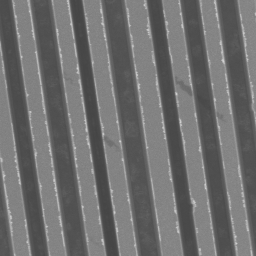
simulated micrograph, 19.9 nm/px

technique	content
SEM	parallel lines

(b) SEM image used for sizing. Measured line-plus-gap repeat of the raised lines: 0.734 microns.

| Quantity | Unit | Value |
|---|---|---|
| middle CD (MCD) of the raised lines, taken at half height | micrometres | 0.406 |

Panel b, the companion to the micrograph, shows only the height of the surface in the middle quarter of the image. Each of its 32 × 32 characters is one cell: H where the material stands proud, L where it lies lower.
HHHHLLLHHHHHLLLLLHHHHHHLLLLHHHHH
HHHHLLLHHHHHLLLLLHHHHHHLLLLHHHHH
HHHHLLLHHHHHLLLLLLHHHHHHLLLHHHHH
HHHHLLLHHHHHLLLLLLHHHHHHLLLHHHHH
HHHHHLLHHHHHLLLLLLHHHHHHLLLHHHHH
HHHHHLLHHHHHLLLLLLHHHHHHLLLHHHHH
HHHHHLLLHHHHHLLLLLHHHHHHLLLLHHHH
HHHHHLLLHHHHHLLLLLHHHHHHLLLLHHHH
HHHHHLLLHHHHHLLLLLHHHHHHLLLLHHHH
HHHHHLLLHHHHHLLLLLLHHHHHHLLLHHHH
HHHHHLLLHHHHHLLLLLLHHHHHHLLLHHHH
LHHHHHLLHHHHHHLLLLLHHHHHHLLLHHHH
LHHHHHLLHHHHHHLLLLLHHHHHHLLLHHHH
LHHHHHLLLHHHHHLLLLLHHHHHHLLLLHHH
LHHHHHLLLHHHHHLLLLLHHHHHHLLLLHHH
LHHHHHLLLHHHHHLLLLLHHHHHHLLLLHHH
LHHHHHLLLHHHHHLLLLLLHHHHHHLLLHHH
LHHHHHLLLHHHHHLLLLLLHHHHHHLLLHHH
LLHHHHHLLHHHHHLLLLLLHHHHHHLLLHHH
LLHHHHHLLHHHHHLLLLLLHHHHHHLLLHHH
LLHHHHHLLLHHHHHLLLLLHHHHHHLLLLHH
LLHHHHHLLLHHHHHLLLLLHHHHHHLLLLHH
LLHHHHHLLLHHHHHLLLLLHHHHHHLLLLHH
LLHHHHHLLLHHHHHLLLLLLHHHHHHLLLHH
LLHHHHHLLLHHHHHLLLLLLHHHHHHLLLHH
LLLHHHHHLLHHHHHLLLLLLHHHHHHLLLHH
LLLHHHHHLLHHHHHLLLLLLHHHHHHLLLHH
LLLHHHHHLLLHHHHHLLLLLHHHHHHLLLLH
LLLHHHHHLLLHHHHHLLLLLHHHHHHLLLLH
LLLHHHHHLLLHHHHHLLLLLHHHHHHLLLLH
LLLHHHHHLLLHHHHHLLLLLLHHHHHHLLLH
LLLLHHHHLLLHHHHHLLLLLLHHHHHHLLLH